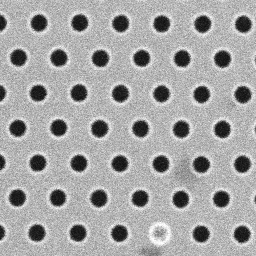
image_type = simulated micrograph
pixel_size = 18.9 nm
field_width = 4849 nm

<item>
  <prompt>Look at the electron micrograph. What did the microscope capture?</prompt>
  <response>a regular array of holes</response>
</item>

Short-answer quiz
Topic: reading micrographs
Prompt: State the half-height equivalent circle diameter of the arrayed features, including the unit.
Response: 18.2 pixels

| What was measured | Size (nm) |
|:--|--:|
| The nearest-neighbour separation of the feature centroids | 760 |